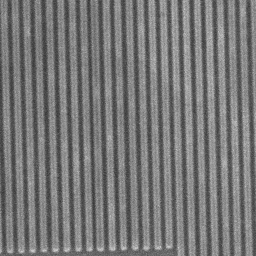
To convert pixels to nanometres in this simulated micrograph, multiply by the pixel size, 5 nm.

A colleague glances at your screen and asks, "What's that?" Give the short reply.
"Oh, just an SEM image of parallel lines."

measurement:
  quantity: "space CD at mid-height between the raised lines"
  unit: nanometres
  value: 31.2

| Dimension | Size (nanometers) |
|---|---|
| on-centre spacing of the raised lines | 56.9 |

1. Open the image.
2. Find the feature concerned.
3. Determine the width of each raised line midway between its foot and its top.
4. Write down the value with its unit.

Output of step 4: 4.5 px